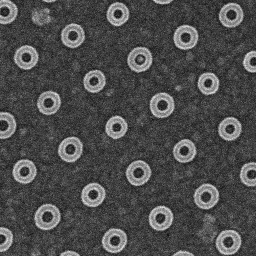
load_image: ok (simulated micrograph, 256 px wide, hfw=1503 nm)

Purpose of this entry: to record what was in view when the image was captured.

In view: a regular array of ring-shaped raised bodies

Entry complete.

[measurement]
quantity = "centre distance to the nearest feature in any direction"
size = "294 nm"